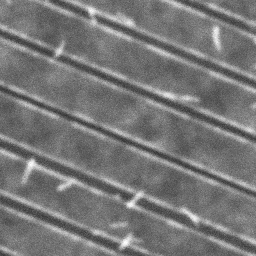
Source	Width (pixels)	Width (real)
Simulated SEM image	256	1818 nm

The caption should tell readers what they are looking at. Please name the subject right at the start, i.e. parallel lines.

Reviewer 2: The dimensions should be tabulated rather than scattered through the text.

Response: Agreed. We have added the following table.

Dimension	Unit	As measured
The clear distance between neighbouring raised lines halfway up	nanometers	67.1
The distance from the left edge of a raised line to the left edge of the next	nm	359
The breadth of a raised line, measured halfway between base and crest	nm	295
